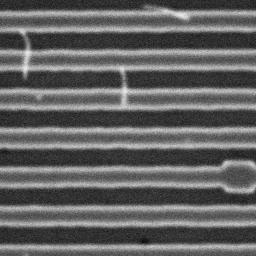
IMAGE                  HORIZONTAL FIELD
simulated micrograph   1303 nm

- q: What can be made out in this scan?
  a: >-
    wiring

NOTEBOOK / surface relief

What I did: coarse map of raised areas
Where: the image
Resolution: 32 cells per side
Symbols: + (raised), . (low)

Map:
................................
....................++..........
++++++++++++++++++++++++++++++++
++++++++++++++++++++++++++++++++
................................
................................
++++++++++++++++++++++++++++++++
++++++++++++++++++++++++++++++++
++++++++++++++++++++++++++++++++
................................
................................
++++++++++++++++++++++++++++++++
++++++++++++++++++++++++++++++++
.+++++++++++++++++++++...++....+
................................
................................
++++++++++++++++++++++++++++++++
++++++++++++++++++++++++++++++++
................................
................................
............................++++
++++++++++++++++++++++++++++++++
++++++++++++++++++++++++++++++++
............................++++
................................
................................
++++++++++++++++++++++++++++++++
++++++++++++++++++++++++++++++++
................................
................................
................................
++++++++++++++++++++++++++++++++